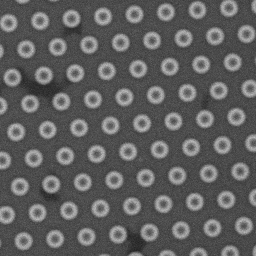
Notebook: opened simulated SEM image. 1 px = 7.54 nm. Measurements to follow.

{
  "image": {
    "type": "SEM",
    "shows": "an array of small figures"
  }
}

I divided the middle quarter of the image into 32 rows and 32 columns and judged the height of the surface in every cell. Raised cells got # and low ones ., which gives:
.###.....###....#####...#####...
.####....####...#####...#####...
.####....####....###.....###....
.####....###....................
................................
.............................###
..............##.....####....###
#....####....####....####....###
#....####....####....####....###
##...####....####.....##........
#.....###.......................
................................
..........................###...
...........##.....###....####...
..###.....####...#####...####...
..####....####...#####...####...
..####....####....###...........
..###......#....................
................................
.......................##.....##
.......##.....####....####....##
##....####....####....####....##
##....####....####....####....##
##....####....####.....#........
##.....##.......................
................................
....................#......###..
....#......###....####....#####.
...####...#####...#####...####..
...####...#####...####.....###..
...####....###.....##...........
....##..........................